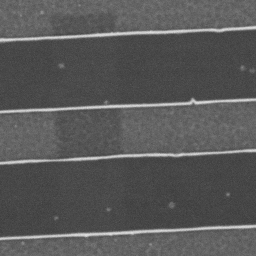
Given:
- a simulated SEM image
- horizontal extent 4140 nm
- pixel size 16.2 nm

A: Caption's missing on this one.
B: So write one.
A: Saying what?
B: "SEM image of one or a few lines or trenches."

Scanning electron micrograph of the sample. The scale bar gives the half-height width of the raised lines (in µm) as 1.2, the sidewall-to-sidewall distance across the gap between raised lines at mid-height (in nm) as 803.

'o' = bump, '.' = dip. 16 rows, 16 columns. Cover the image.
................
................
oooooooooooooooo
oooooooooooooooo
oooooooooooooooo
oooooooooooooooo
oooooooooooo....
................
................
..............oo
oooooooooooooooo
oooooooooooooooo
oooooooooooooooo
oooooooooooooooo
ooooooooo.......
................